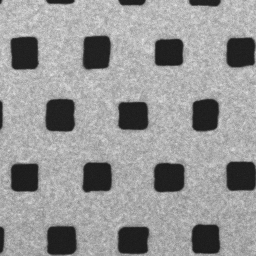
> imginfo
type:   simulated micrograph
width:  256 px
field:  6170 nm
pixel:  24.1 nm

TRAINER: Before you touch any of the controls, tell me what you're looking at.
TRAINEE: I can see a regular array of holes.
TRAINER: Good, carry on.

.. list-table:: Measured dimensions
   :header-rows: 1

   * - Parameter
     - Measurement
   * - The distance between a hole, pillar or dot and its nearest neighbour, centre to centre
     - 1.73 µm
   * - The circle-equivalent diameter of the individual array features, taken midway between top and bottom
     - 765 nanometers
